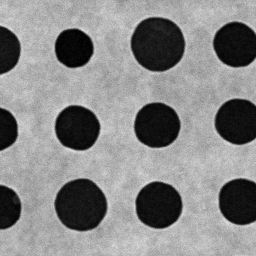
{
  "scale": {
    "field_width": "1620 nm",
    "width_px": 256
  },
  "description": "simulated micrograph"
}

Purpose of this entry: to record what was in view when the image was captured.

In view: holes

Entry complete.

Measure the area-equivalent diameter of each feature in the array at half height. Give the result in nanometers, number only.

295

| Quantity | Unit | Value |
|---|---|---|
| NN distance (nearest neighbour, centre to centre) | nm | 498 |